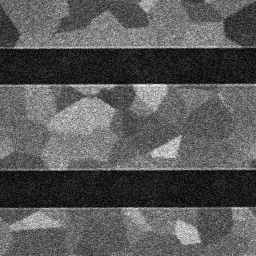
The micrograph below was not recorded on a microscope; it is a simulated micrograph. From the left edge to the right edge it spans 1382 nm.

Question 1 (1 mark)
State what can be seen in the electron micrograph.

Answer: one or a few lines or trenches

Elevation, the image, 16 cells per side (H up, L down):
HHHHHHHHHHHHHHHH
HHHHHHHHHHHHHHHH
HHHHHHHHHHHHHHHH
LLLLLLLLLLLLLLLL
LLLLLLLLLLLLLLLL
HHHHHHHHHHHHHHHH
HHHHHHHHHHHHHHHH
HHHHHHHHHHHHHHHH
HHHHHHHHHHHHHHHH
HHHHHHHHHHHHHHHH
HHHHHHHHHHHHHHHH
LLLLLLLLLLLLLLLL
LLLLLLLLLLLLLLLL
HHHHHHHHHHHHHHHH
HHHHHHHHHHHHHHHH
HHHHHHHHHHHHHHHH